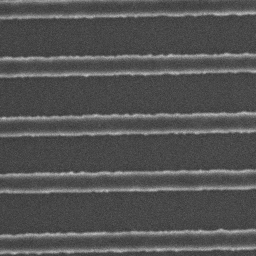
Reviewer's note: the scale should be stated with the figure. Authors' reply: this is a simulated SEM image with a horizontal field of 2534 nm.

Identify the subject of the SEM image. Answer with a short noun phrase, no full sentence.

lines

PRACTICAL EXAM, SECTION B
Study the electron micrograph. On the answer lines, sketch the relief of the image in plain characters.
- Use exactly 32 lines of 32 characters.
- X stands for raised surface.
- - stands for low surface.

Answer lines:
XXXXXXXXXXXXXXXXXXXXXXXXXXXXXXXX
XXXXXXXXXXXXXXXXXXXXXXXXXXXXXXXX
--------------------------------
--------------------------------
--------------------------------
--------------------------------
--------------------------------
XXXXXXXXXXXXXXXXXXXXXXXXXXXXXXXX
XXXXXXXXXXXXXXXXXXXXXXXXXXXXXXXX
XXXX----------------------------
--------------------------------
--------------------------------
--------------------------------
--------------------------------
--------X-XXXXXXXXXXXXXXXXXXXXXX
XXXXXXXXXXXXXXXXXXXXXXXXXXXXXXXX
XXXXXXXXXXXXXXXXXXXXXXXXXXXXXXXX
--------------------------------
--------------------------------
--------------------------------
--------------------------------
--------------------XXXXXXXXXXXX
XXXXXXXXXXXXXXXXXXXXXXXXXXXXXXXX
XXXXXXXXXXXXXXXXXXXXXXXXXXXXXXXX
--------------------------------
--------------------------------
--------------------------------
--------------------------------
--------------------------------
XXXXXXXXXXXXXXXXXXXXXXXXXXXXXXXX
XXXXXXXXXXXXXXXXXXXXXXXXXXXXXXXX
XXXXXXXXXX----------------------